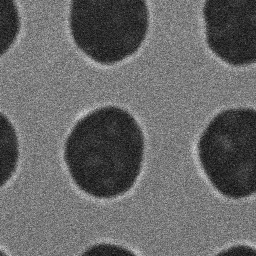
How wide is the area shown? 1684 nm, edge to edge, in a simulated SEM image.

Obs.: holes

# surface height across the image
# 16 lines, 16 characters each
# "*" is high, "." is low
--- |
.***.....****...
.***.....****...
.****....****...
*****...******..
****************
****************
****************
.****....****...
.***.....****...
.***.....***....
.***.....****...
*****...*****...
****************
****************
****************
******..******..